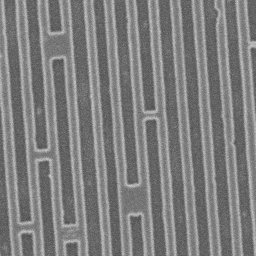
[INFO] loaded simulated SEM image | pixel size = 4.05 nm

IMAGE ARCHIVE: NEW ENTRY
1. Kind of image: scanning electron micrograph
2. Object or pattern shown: parallel lines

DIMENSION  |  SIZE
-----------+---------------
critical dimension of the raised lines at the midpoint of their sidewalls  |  33.8 nm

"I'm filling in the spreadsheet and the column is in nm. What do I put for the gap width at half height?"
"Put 52.4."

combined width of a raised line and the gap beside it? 89.2 nanometres